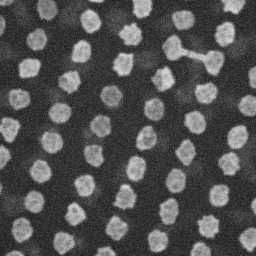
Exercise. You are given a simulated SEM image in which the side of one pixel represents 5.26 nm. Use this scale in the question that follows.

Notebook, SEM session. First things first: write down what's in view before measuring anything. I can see a regular array of raised bodies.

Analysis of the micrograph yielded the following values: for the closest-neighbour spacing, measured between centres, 161 nanometres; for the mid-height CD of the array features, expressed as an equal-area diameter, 0.103 micrometres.